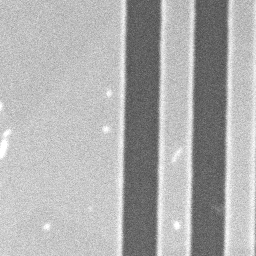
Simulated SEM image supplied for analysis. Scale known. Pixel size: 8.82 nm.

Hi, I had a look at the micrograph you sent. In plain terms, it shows wiring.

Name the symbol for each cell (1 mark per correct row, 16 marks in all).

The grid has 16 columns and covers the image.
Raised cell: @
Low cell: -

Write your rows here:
@@@@@@@@--@@--@@
@@@@@@@@--@@--@@
@@@@@@@@--@@--@@
@@@@@@@@--@@--@@
@@@@@@@@--@@--@@
@@@@@@@@--@@--@@
@@@@@@@@--@@--@@
@@@@@@@@--@@--@@
@@@@@@@@--@@--@@
@@@@@@@@--@@--@@
@@@@@@@@--@@--@@
@@@@@@@@--@@--@@
@@@@@@@@--@@--@@
@@@@@@@@--@@--@@
@@@@@@@@--@@--@@
@@@@@@@@--@@--@@